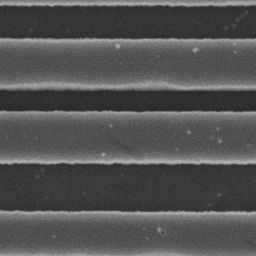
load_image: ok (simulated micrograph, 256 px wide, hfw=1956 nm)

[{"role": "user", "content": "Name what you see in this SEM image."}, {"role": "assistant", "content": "lines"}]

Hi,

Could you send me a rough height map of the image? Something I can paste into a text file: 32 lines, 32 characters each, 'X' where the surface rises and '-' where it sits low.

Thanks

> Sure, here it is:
XXXXXXXXXXXXXXXXXXXXXXXXXXXXXXXX
--------------------------------
--------------------------------
--------------------------------
--------------------------------
XXXXXXXXXXXXXXXXXXXXXXXXXXXXXXXX
XXXXXXXXXXXXXXXXXXXXXXXXXXXXXXXX
XXXXXXXXXXXXXXXXXXXXXXXXXXXXXXXX
XXXXXXXXXXXXXXXXXXXXXXXXXXXXXXXX
XXXXXXXXXXXXXXXXXXXXXXXXXXXXXXXX
XXXXXXXXXXXXXXXXXXXXXXXXXXXXXXXX
--------------------------------
--------------------------------
--------------------------------
XXXXXXXXXXXXXXXXXXXXXXXXXXXXXXXX
XXXXXXXXXXXXXXXXXXXXXXXXXXXXXXXX
XXXXXXXXXXXXXXXXXXXXXXXXXXXXXXXX
XXXXXXXXXXXXXXXXXXXXXXXXXXXXXXXX
XXXXXXXXXXXXXXXXXXXXXXXXXXXXXXXX
XXXXXXXXXXXXXXXXXXXXXXXXXXXXXXXX
-----XX------X---XX--XX-X-XXXXXX
--------------------------------
--------------------------------
--------------------------------
--------------------------------
--------------------------------
XXX-XXXXX-XXXXX------XXX--X-----
XXXXXXXXXXXXXXXXXXXXXXXXXXXXXXXX
XXXXXXXXXXXXXXXXXXXXXXXXXXXXXXXX
XXXXXXXXXXXXXXXXXXXXXXXXXXXXXXXX
XXXXXXXXXXXXXXXXXXXXXXXXXXXXXXXX
XXXXXXXXXXXXXXXXXXXXXXXXXXXXXXXX